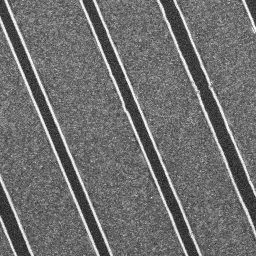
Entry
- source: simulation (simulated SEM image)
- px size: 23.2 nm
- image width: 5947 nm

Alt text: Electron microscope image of one or a few lines or trenches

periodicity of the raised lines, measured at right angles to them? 1810 nm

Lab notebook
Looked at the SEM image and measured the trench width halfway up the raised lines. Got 1420 nm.